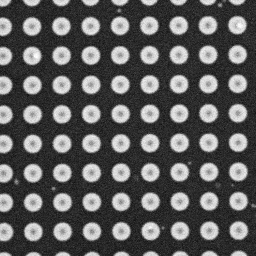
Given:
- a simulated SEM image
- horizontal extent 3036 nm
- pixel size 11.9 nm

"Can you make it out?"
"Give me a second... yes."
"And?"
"an array of small figures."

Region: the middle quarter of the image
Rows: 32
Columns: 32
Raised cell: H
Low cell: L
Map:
LLLLLLLLLLLLLLLLLLLLLLLLLLLLLLLL
LLLLLLLLLLLLLLLLLLLLLLLLLLLLLLLL
LLLLLLLLLLLLLLLLLLLLLLLLLLLLLLLL
HLLLLHHHLLLLLHHHLLLLHHHLLLLHHHLL
HLLLLHHHHLLLHHHHLLLHHHHHLLLHHHHL
HHLLLHHHHLLLHHHHLLLHHHHHLLLHHHHL
HLLLLHHHHLLLHHHHLLLLHHHLLLLHHHHL
LLLLLLLLLLLLLLLLLLLLLLLLLLLLLLLL
LLLLLLLLLLLLLLLLLLLLLLLLLLLLLLLL
LLLLLLLLLLLLLLLLLLLLLLLLLLLLLLLL
LLLLLLHHLLLLLHHLLLLLHHHLLLLLHHLL
HLLLLHHHHLLLHHHHLLLHHHHLLLLHHHHL
HHLLLHHHHLLLHHHHLLLHHHHHLLLHHHHL
HLLLLHHHHLLLHHHHLLLLHHHLLLLHHHHL
LLLLLLHHLLLLLHHLLLLLLHLLLLLLHHLL
LLLLLLLLLLLLLLLLLLLLLLLLLLLLLLLL
LLLLLLLLLLLLLLLLLLLLLLLLLLLLLLLL
LLLLLLLLLLLLLLLLLLLLLLLLLLLLLLLL
HLLLLHHHHLLLHHHHLLLLHHHLLLLHHHHL
HHLLLHHHHLLLHHHHLLLHHHHHLLLHHHHL
HHLLLHHHHLLLHHHHLLLHHHHHLLLHHHHL
HLLLLHHHLLLLLHHHLLLLHHHLLLLLHHLL
LLLLLLLLLLLLLLLLLLLLLLLLLLLLLLLL
LLLLLLLLLLLLLLLLLLLLLLLLLLLLLLLL
LLLLLLLLLLLLLLLLLLLLLLLLLLLLLLLL
HLLLLHHHLLLLLHHHLLLLHHHLLLLHHHHL
HHLLLHHHHLLLHHHHLLLHHHHHLLLHHHHL
HHLLLHHHHLLLHHHHLLLHHHHHLLLHHHHL
HLLLLHHHHLLLHHHHLLLLHHHLLLLHHHHL
LLLLLLLLLLLLLLLLLLLLLLLLLLLLLLLL
LLLLLLLLLLLLLLLLLLLLLLLLLLLLLLLL
LLLLLLLLLLLLLLLLLLLLLLLLLLLLLLLL